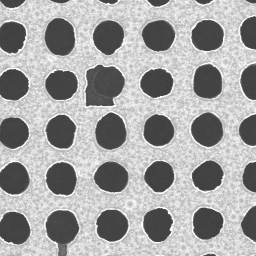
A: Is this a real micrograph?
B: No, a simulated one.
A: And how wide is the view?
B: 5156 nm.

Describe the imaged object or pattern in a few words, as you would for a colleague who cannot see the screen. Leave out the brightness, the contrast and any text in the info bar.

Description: a regular array of holes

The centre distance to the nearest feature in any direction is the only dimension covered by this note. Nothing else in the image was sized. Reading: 928 nanometres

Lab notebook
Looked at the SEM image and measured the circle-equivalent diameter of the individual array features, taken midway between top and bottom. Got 644 nm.